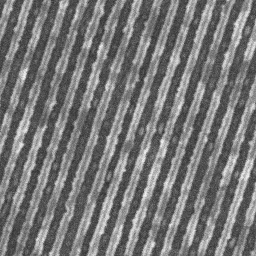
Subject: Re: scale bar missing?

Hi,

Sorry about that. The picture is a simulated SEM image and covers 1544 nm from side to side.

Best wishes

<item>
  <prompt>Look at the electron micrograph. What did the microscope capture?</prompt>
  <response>parallel lines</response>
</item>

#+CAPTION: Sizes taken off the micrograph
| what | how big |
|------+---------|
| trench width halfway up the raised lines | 60.1 nm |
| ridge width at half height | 44.4 nm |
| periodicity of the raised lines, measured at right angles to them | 105 nm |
